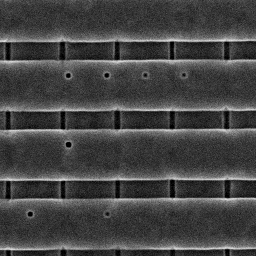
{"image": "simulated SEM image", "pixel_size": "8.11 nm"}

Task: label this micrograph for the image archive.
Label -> wiring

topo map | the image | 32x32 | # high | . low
################################
################################
################################
################################
################################
................................
................................
................................
################################
################################
################################
################################
################################
################################
................................
................................
################################
################################
################################
################################
################################
################################
.##..###..##....................
................................
................................
################################
################################
################################
################################
################################
################################
................................